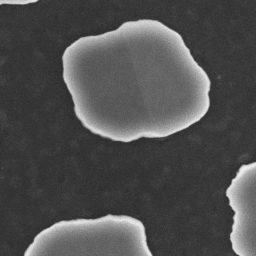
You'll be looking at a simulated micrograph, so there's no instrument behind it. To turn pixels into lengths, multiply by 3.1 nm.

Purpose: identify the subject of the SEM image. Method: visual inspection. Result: raised bodies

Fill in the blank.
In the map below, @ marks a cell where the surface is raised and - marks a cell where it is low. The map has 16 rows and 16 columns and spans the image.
----------------
--------@@------
-----@@@@@@-----
----@@@@@@@@----
----@@@@@@@@@---
----@@@@@@@@@---
-----@@@@@@@@---
-----@@@@@@@----
-------@@@------
----------------
---------------@
--------------@@
--------------@@
---------------@
---@@@@@@-----@@
--@@@@@@@------@